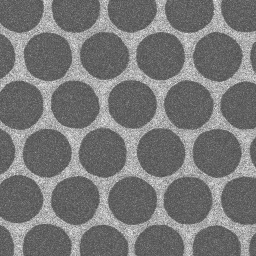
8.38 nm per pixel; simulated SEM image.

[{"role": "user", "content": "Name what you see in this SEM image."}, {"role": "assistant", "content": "a regular array of holes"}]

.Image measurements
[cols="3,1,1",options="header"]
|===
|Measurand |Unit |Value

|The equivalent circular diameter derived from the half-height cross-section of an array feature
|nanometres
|408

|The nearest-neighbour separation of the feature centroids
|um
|0.462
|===